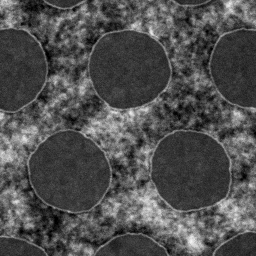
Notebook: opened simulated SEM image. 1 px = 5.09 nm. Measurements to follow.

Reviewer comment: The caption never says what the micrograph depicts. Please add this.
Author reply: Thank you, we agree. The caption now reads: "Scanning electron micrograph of raised bodies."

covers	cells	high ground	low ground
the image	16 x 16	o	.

................
................
oo....oooo....oo
ooo...oooo...ooo
ooo...ooooo..ooo
ooo...oooo....oo
oo.....oo......o
................
...oo.....ooo...
..oooo....oooo..
..ooooo..ooooo..
..ooooo...oooo..
...ooo....oooo..
................
...............o
oo....oooo....oo